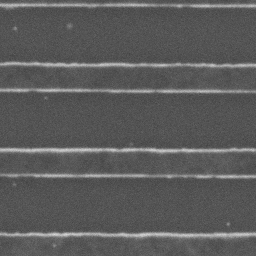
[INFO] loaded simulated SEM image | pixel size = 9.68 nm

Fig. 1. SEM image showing lines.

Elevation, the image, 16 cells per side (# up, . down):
................
................
................
................
################
################
................
................
................
################
################
................
................
................
................
################